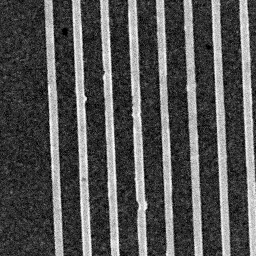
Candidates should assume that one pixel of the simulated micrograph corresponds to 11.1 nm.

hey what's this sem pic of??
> parallel lines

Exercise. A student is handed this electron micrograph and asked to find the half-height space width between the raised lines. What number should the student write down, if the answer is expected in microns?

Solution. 0.234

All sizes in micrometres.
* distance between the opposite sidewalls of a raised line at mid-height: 0.0751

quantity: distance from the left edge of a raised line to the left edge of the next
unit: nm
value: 310